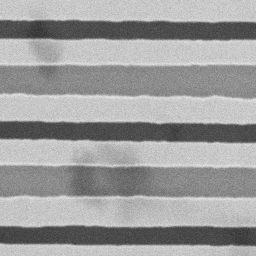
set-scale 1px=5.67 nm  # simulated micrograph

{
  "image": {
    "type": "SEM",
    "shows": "lines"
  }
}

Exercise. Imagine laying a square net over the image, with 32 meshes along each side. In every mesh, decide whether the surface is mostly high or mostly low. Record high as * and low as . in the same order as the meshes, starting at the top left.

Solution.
********************************
********************************
.****..**.**********************
................................
................................
********************************
********************************
********************************
................................
................................
................................
................................
********************************
********************************
********************************
..............................*.
................................
*******.........................
********************************
********************************
**..****************************
................................
................................
................................
................................
********************************
********************************
********************************
................................
................................
*...............................
********************************